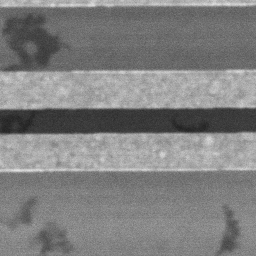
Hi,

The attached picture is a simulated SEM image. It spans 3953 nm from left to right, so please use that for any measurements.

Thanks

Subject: lines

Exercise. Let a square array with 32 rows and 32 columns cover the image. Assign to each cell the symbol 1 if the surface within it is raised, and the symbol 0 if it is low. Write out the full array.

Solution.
11111111111111111111111111111111
00000000000000000000000000000000
00000000000000000000000000000000
00000000000000000000000000000000
00000000000000000000000000000000
00000000000000000000000000000000
00000000000000000000000000000000
00000000000000000000000000000000
00000000000000000000000000000000
11111111111111111111111111111111
11111111111111111111111111111111
11111111111111111111111111111111
11111111111111111111111111111111
11111100110000000000000000000000
00000000000000000000000000000000
00000000000000000000000000000000
00000000000000000000000000000000
11111111111111111111111111111111
11111111111111111111111111111111
11111111111111111111111111111111
11111111111111111111111111111111
00000000000000000000000000000000
00000000000000000000000000000000
00000000000000000000000000000000
00000000000000000000000000000000
00000000000000000000000000000000
00000000000000000000000000000000
00000000000000000000000000000000
00000000000000000000000000000000
00000000000000000000000000000000
00000000000000000000000000000000
00000000000000000000000000000000